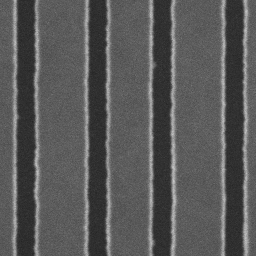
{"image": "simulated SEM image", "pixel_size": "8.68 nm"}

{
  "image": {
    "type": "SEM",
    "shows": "lines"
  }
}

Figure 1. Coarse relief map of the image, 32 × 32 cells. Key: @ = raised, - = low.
@@--@@@@@@@--@@@@@@---@@@@@@---@
@@--@@@@@@@---@@@@@--@@@@@@@---@
@@--@@@@@@@---@@@@@---@@@@@@---@
@@--@@@@@@@--@@@@@@---@@@@@@---@
@@--@@@@@@@--@@@@@@--@@@@@@@---@
@@--@@@@@@@--@@@@@@---@@@@@@--@@
@@--@@@@@@@--@@@@@@---@@@@@@---@
@@---@@@@@@--@@@@@@--@@@@@@@--@@
@@--@@@@@@@--@@@@@@--@@@@@@@---@
@@--@@@@@@@--@@@@@@--@@@@@@@---@
@@--@@@@@@@--@@@@@@---@@@@@@--@@
@@--@@@@@@@--@@@@@@--@@@@@@@--@@
@@--@@@@@@@--@@@@@@--@@@@@@@---@
@@--@@@@@@@--@@@@@@--@@@@@@@---@
@@---@@@@@@--@@@@@@--@@@@@@@---@
@@--@@@@@@@--@@@@@@--@@@@@@@---@
@@--@@@@@@@--@@@@@@--@@@@@@@---@
@@---@@@@@@--@@@@@@--@@@@@@@---@
@@--@@@@@@@--@@@@@@--@@@@@@@--@@
@@--@@@@@@@--@@@@@@---@@@@@@--@@
@@--@@@@@@@--@@@@@@--@@@@@@@---@
@@---@@@@@@--@@@@@@---@@@@@@---@
@@--@@@@@@@--@@@@@@---@@@@@@---@
@@--@@@@@@@--@@@@@@---@@@@@@--@@
@@--@@@@@@@--@@@@@@---@@@@@@---@
@@---@@@@@@--@@@@@@---@@@@@@---@
@@---@@@@@@--@@@@@@---@@@@@@---@
@@--@@@@@@@--@@@@@@--@@@@@@@---@
@@--@@@@@@@--@@@@@@--@@@@@@@--@@
@@--@@@@@@@--@@@@@@---@@@@@@--@@
@@--@@@@@@@--@@@@@@--@@@@@@@--@@
@@--@@@@@@@--@@@@@@--@@@@@@@---@